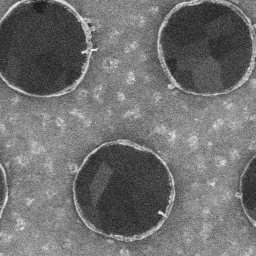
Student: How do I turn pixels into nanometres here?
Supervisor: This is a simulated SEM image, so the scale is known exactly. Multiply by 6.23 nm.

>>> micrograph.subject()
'raised bodies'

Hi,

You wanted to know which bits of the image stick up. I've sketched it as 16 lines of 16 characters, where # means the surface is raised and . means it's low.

.###.......####.
#####.....######
######....######
######....######
#####.....######
.####......####.
................
................
................
......####......
.....#####.....#
.....######....#
.....######....#
.....#####.....#
......####......
................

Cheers